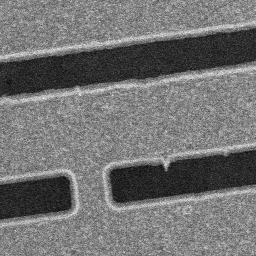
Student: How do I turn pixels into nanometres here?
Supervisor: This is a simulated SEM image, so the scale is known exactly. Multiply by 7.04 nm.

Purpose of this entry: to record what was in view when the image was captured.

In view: one or a few lines or trenches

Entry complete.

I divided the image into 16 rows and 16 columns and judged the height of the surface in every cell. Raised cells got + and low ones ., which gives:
++++++++++++++++
+++++++++++++++.
++++++++........
+...............
..............++
.......+++++++++
++++++++++++++++
++++++++++++++++
++++++++++++++++
+++++++++++++...
+++++++.........
.....++.........
.....++....+++++
....++++++++++++
++++++++++++++++
++++++++++++++++